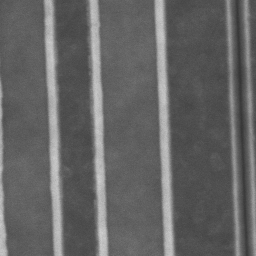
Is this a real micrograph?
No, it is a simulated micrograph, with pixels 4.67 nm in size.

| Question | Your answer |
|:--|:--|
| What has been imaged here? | one or a few lines or trenches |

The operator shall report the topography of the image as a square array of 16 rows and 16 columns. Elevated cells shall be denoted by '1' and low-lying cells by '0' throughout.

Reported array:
0001110000111101
0001110000111101
0001110000111111
0001110000111111
0001110000111111
0001110000111111
0001110000111111
0001110000111111
0001110000111110
0001110000111110
0001110000111110
0001110000111110
0000110000111110
0000110000111110
0000110000011110
0000110000011110